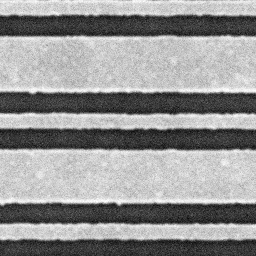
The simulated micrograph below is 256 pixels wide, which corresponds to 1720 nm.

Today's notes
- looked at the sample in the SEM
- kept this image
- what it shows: lines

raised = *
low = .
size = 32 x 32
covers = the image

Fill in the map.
********************************
********************************
................................
................................
................................
********************************
********************************
********************************
********************************
********************************
********************************
................................
................................
................................
********************************
********************************
................................
................................
................................
********************************
********************************
********************************
********************************
********************************
********************************
................................
................................
................................
********************************
********************************
................................
................................